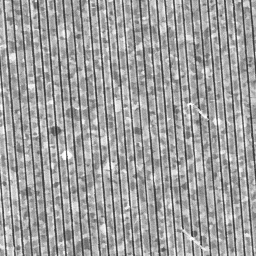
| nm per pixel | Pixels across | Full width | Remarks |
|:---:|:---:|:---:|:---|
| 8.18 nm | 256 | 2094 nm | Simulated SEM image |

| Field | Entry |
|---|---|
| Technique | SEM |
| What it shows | parallel lines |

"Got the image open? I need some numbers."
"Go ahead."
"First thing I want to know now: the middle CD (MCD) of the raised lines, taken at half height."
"45.9 nm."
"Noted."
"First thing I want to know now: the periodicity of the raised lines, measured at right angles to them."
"0.0694 micrometres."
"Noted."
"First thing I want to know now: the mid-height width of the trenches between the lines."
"0.0224 micrometres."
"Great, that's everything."